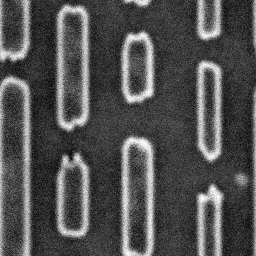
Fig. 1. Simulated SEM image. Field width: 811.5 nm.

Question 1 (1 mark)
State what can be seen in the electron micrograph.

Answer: one or a few lines or trenches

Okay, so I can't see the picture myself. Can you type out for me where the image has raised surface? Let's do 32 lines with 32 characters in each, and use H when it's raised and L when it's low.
HHHLLLLLLLLLLLLLLLLLLLLLLHHLLLLL
HHHLLLLLHHLLLLLLLLLLLLLLLHHLLLLL
HHHLLLLHHHHLLLLLLLLLLLLLLHHLLLLL
HHHLLLLHHHHLLLLLLLLLLLLLLHHLLLLL
HHHLLLLHHHHLLLLLLHLLLLLLLHLLLLLL
HHHLLLLHHHHLLLLLHHHLLLLLLLLLLLLL
HHHLLLLHHHHLLLLLHHHLLLLLLLLLLLLL
LLLLLLLHHHHLLLLLHHHLLLLLLLLLLLLL
LLLLLLLHHHHLLLLLHHHLLLLLLHHLLLLL
LLLLLLLHHHHLLLLLHHHLLLLLLHHLLLLL
HHHLLLLHHHHLLLLLHHHLLLLLLHHLLLLL
HHHLLLLHHHHLLLLLHHHLLLLLLHHLLLLL
HHHLLLLHHHHLLLLLLLLLLLLLLHHLLLLL
HHHLLLLHHHHLLLLLLLLLLLLLLHHLLLLL
HHHLLLLHHHHLLLLLLLLLLLLLLHHLLLLL
HHHLLLLLHLLLLLLLLLLLLLLLLHHLLLLL
HHHLLLLLLLLLLLLLLLLLLLLLLHHLLLLL
HHHLLLLLLLLLLLLLHLLLLLLLLHHLLLLL
HHHLLLLLLLLLLLLLHHHLLLLLLHHLLLLL
HHHLLLLLLLLLLLLLHHHLLLLLLLHLLLLL
HHHLLLLLHHLLLLLLHHHLLLLLLLLLLLLL
HHHLLLLLHHHLLLLLHHHLLLLLLLLLLLLL
HHHLLLLHHHHLLLLLHHHLLLLLLLLLLLLL
HHHLLLLHHHHLLLLLHHHLLLLLLLLLLLLL
HHHLLLLHHHHLLLLLHHHLLLLLLLHHLLLL
HHHLLLLHHHHLLLLLHHHLLLLLLHHLLLLL
HHHLLLLHHHHLLLLLHHHLLLLLLHHLLLLL
HHHLLLLHHHHLLLLLHHHLLLLLLHHLLLLL
HHHLLLLLHHHLLLLLHHHLLLLLLHHLLLLL
HHHLLLLLLLLLLLLLHHHLLLLLLHHLLLLL
HHHLLLLLLLLLLLLLHHHLLLLLLHHLLLLL
HHHLLLLLLLLLLLLLHHHLLLLLLHHLLLLL